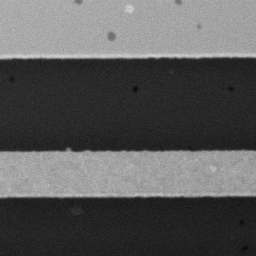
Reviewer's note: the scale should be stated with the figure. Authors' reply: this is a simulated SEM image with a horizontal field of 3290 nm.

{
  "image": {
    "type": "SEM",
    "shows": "lines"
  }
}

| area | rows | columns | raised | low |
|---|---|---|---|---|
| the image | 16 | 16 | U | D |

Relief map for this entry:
UUUUUUUUUUUUUUUU
UUUUUUUUUUUUUUUU
UUUUUUUUUUUUUUUU
UUUUUUUUUUUUUUUU
DDDDDDDDDDDDDDDD
DDDDDDDDDDDDDDDD
DDDDDDDDDDDDDDDD
DDDDDDDDDDDDDDDD
DDDDDDDDDDDDDDDD
DDDUDUDUUUUUUUUU
UUUUUUUUUUUUUUUU
UUUUUUUUUUUUUUUU
DDDDDDDDDDDDDDDD
DDDDDDDDDDDDDDDD
DDDDDDDDDDDDDDDD
DDDDDDDDDDDDDDDD